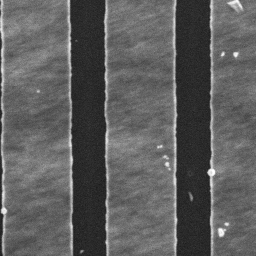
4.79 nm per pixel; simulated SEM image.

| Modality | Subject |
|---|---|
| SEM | lines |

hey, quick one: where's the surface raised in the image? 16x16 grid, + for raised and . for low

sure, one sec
++++...++++..+++
++++...++++..+++
++++...++++..+++
++++...++++..+++
++++...++++..+++
++++...++++..+++
++++...++++..+++
++++...++++..+++
++++...++++..+++
+++++..++++..+++
+++++..++++..+++
+++++..++++..+++
+++++..++++..+++
+++++..++++..+++
+++++..++++..+++
+++++..++++..+++